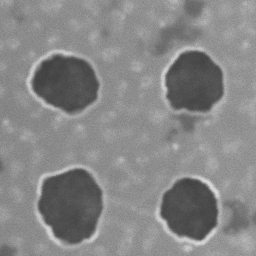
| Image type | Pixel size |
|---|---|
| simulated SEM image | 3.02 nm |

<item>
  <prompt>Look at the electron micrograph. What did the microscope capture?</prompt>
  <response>holes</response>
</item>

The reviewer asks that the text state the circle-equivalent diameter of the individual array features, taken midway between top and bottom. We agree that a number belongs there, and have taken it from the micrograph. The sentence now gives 182 nm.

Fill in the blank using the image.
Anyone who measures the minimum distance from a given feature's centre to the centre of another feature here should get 0.363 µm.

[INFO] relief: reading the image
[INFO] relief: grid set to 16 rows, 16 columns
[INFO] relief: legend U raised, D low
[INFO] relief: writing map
UUUUUUUUUUUUUUUU
UUUUUUUUUUUUUUUU
UUUUUUUUUUUUUUUU
UUUUUUUUUUUDDUUU
UUDDDDUUUUDDDDUU
UUDDDDUUUUDDDDUU
UUUDDDUUUUUDDUUU
UUUUUUUUUUUUUUUU
UUUUUUUUUUUUUUUU
UUUUUUUUUUUUUUUU
UUUUUUUUUUUUUUUU
UUUDDDUUUUUDDUUU
UUDDDDUUUUDDDDUU
UUUDDDUUUUDDDDUU
UUUDDDUUUUUDDUUU
UUUUUUUUUUUUUUUU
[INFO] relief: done